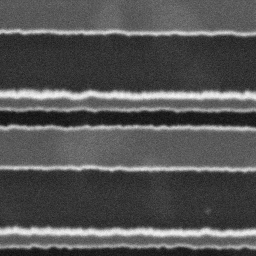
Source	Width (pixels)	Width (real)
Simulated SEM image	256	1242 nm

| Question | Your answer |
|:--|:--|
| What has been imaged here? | lines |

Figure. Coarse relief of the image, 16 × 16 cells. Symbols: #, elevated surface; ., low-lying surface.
################
################
................
................
................
................
################
################
################
################
#####.##########
................
................
................
................
################